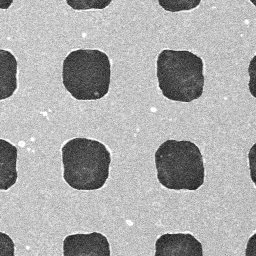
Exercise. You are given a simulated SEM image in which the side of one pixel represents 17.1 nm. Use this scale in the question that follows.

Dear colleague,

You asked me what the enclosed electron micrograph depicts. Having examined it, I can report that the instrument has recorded holes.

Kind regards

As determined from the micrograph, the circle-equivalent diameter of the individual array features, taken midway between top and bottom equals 898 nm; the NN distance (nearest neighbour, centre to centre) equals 1540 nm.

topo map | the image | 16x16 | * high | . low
*****.****..****
****************
****************
.***...***..****
.***...***...***
.***...***...***
****************
****************
****************
.***...***...***
.***...***...***
.***..****...***
****************
****************
****************
.***...***...**.